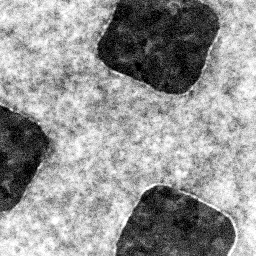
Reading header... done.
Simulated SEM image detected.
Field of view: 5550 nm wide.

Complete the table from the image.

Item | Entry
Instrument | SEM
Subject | raised bodies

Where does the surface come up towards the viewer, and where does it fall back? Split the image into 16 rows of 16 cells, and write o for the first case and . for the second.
.......oooooo...
.......ooooooo..
......ooooooo...
......ooooooo...
.......oooooo...
..........oo....
................
oo..............
ooo.............
ooo.............
oo..............
oo..............
o........ooo....
........oooooo..
........ooooooo.
.......oooooooo.